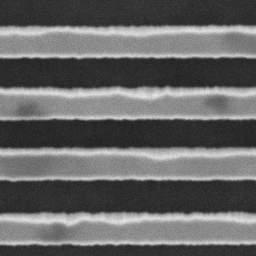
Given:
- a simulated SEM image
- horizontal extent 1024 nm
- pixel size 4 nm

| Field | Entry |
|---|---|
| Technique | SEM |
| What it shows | lines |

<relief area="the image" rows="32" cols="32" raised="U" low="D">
DDDDDDDDDDDDDDDDDDDDDDDDDDDDDDDD
DDDDDDDDDDDDDDDDDDDDDDDDDDDDDDDD
DDDDDDDDDDDDDDDDDDDDDDDDDDDDDDDD
DDDDDDDUUDDDDDDDDDDDDDDUUDUDUUUD
UUUUUUUUUUUUUUUUUUUUUUUUUUUUUUUU
UUUUUUUUUUUUUUUUUUUUUUUUUUUUUUUU
UUUUUUUUUUUUUUUUUUUUUUUUUUUUUUUU
DDDDDDDDDDDDDDDDDDDDDDDDDDDDDDDD
DDDDDDDDDDDDDDDDDDDDDDDDDDDDDDDD
DDDDDDDDDDDDDDDDDDDDDDDDDDDDDDDD
DDDDDDDDDDDDDDDDDDDDDDDDDDDDDDDD
UUUUUUUUUUUUUUUUUUUUUUUUUUUUUUUU
UUUUUUUUUUUUUUUUUUUUUUUUUUUUUUUU
UUUUUUUUUUUUUUUUUUUUUUUUUUUUUUUU
UUUUUUUUUUUUUUUUUUUUUUUUUUUUUUUU
DDDDDDDDDDDDDDDDDDDDDDDDDDDDDDDD
DDDDDDDDDDDDDDDDDDDDDDDDDDDDDDDD
DDDDDDDDDDDDDDDDDDDDDDDDDDDDDDDD
DDDDDDDDDDDDDDDDDDDDDDDDDDDDDDDD
UUUUUUUUUUUUUUUUUUUUUUUUUUUUUUUU
UUUUUUUUUUUUUUUUUUUUUUUUUUUUUUUU
UUUUUUUUUUUUUUUUUUUUUUUUUUUUUUUU
DUUDDDDDDDDDDDDDDDDDDDDDDDDDDDDD
DDDDDDDDDDDDDDDDDDDDDDDDDDDDDDDD
DDDDDDDDDDDDDDDDDDDDDDDDDDDDDDDD
DDDDDDDDDDDDDDDDDDDDDDDDDDDDDDDD
DDDDDDDDDDDDDDDDDDDDDDDDDDDDDDDD
UUUUUUUUUUUUUUUUUUUUUUUUUUUUUUUU
UUUUUUUUUUUUUUUUUUUUUUUUUUUUUUUU
UUUUUUUUUUUUUUUUUUUUUUUUUUUUUUUU
UUUUUUUUDUUUUUUUUUUUUUUUUUUUUUUU
DDDDDDDDDDDDDDDDDDDDDDDDDDDDDDDD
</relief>